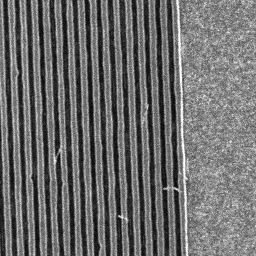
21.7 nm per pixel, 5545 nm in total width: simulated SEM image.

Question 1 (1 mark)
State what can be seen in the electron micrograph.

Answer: parallel lines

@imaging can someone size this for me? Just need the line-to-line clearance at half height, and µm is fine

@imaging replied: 0.116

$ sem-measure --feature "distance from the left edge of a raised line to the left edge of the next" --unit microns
0.253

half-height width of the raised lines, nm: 135